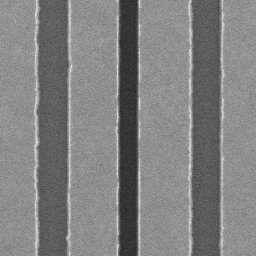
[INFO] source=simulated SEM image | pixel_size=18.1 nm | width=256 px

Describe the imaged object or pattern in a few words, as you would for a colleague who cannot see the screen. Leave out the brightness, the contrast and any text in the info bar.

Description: one or a few lines or trenches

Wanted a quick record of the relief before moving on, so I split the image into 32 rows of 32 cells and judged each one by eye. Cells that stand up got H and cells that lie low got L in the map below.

HHHHHLLLLHHHHHHLLHHHHHHHLLLLHHHH
HHHHHLLLLHHHHHHLLHHHHHHHLLLLHHHH
HHHHHLLLLHHHHHHLLHHHHHHHLLLLHHHH
HHHHHLLLLHHHHHHLLHHHHHHHLLLLHHHH
HHHHHLLLLHHHHHHLLHHHHHHHLLLLHHHH
HHHHHLLLLHHHHHHLLHHHHHHHLLLLHHHH
HHHHHLLLLHHHHHHLLHHHHHHHLLLLHHHH
HHHHHLLLLHHHHHHLLHHHHHHHLLLLHHHH
HHHHHLLLLHHHHHHLLHHHHHHHLLLLHHHH
HHHHHLLLLHHHHHHLLHHHHHHHLLLLHHHH
HHHHHLLLLHHHHHHLLHHHHHHHLLLLHHHH
HHHHHLLLLHHHHHHLLHHHHHHHLLLLHHHH
HHHHHLLLLHHHHHHLLHHHHHHHLLLLHHHH
HHHHHLLLLHHHHHHLLHHHHHHHLLLLHHHH
HHHHHLLLLHHHHHHLLHHHHHHHLLLLHHHH
HHHHHLLLLHHHHHHLLHHHHHHHLLLLHHHH
HHHHHLLLLHHHHHHLLHHHHHHHLLLLHHHH
HHHHHLLLLHHHHHHLLHHHHHHHLLLLHHHH
HHHHHLLLLHHHHHHLLHHHHHHHLLLLHHHH
HHHHHLLLLHHHHHHLLHHHHHHHLLLLHHHH
HHHHHLLLLHHHHHHLLHHHHHHHLLLLHHHH
HHHHHLLLLHHHHHHLLHHHHHHHLLLLHHHH
HHHHHLLLLHHHHHHLLHHHHHHHLLLLHHHH
HHHHHLLLLHHHHHHLLHHHHHHHLLLLHHHH
HHHHHLLLLHHHHHHLLHHHHHHHLLLLHHHH
HHHHHLLLLHHHHHHLLHHHHHHHLLLLHHHH
HHHHHLLLLHHHHHHLLHHHHHHHLLLLHHHH
HHHHHLLLLHHHHHHLLHHHHHHHLLLLHHHH
HHHHHLLLLHHHHHHLLHHHHHHHLLLLHHHH
HHHHHLLLHHHHHHHLLHHHHHHHLLLLHHHH
HHHHHLLLHHHHHHHLLHHHHHHHLLLLHHHH
HHHHHLLLLHHHHHHLLHHHHHHHLLLLHHHH